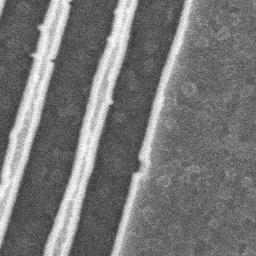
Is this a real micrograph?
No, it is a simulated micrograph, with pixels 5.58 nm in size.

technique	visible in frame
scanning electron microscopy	one or a few lines or trenches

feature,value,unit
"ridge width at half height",79.7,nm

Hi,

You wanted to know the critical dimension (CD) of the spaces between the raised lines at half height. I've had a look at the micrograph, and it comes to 0.28 um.